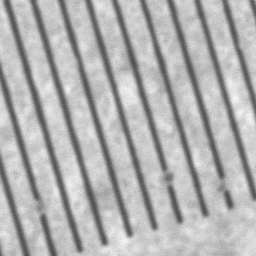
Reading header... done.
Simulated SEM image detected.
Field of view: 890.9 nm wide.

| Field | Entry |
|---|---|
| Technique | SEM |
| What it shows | parallel lines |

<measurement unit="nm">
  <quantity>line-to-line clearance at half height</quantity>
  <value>22.1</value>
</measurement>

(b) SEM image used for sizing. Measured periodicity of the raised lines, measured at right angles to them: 91 nanometers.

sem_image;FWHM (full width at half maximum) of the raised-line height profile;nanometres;68.4